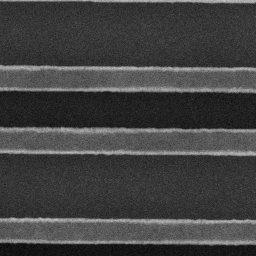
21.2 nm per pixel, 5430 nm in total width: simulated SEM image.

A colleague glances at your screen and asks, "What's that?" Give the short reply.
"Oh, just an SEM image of lines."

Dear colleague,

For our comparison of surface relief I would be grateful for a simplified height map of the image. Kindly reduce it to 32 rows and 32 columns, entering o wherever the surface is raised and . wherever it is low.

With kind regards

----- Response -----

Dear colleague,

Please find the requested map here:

................................
................................
................................
................................
................................
................................
................................
................................
oooooooooooooooooooooooooooooooo
oooooooooooooooooooooooooooooooo
oooooooooooooooooooooooooooooooo
............................o.oo
................................
................................
................................
................................
oooooooooooooooooooooooooooooooo
oooooooooooooooooooooooooooooooo
oooooooooooooooooooooooooooooooo
................................
................................
................................
................................
................................
................................
................................
................................
oooooooooooooooooooooo.oo.......
oooooooooooooooooooooooooooooooo
oooooooooooooooooooooooooooooooo
....................o.oooooooooo
................................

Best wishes